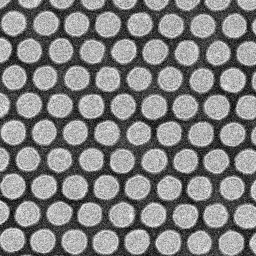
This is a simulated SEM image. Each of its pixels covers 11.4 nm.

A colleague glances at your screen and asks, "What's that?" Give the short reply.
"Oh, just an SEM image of a regular array of raised bodies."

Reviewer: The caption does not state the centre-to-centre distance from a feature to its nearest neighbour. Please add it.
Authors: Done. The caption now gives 30.8 px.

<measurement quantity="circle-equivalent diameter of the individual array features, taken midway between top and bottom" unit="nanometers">276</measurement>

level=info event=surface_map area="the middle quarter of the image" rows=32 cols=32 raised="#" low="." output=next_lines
................................
.####....####....####....###....
.#####..######..######..#####...
######..######..######..######..
######..######..######..#####...
.####...#####....####...#####...
..........##.............###....
................................
#....####....####....####...####
##..######..######..#####...####
##..######..######..######.#####
##..######..######..######.#####
#...#####....####...#####...####
..............##.....##......##.
..##......##......#.............
.#####..#####....####...#####...
######..######..######..#####...
######..######..######.######..#
#####...######..#####...#####..#
.####....####....###....####....
................................
.....###......#.......##......##
##..######..#####...#####...####
##..######..#####...######..####
##..######..#####...######..####
#....#####..#####...#####...####
......#.....####.....###....####
................................
.####....###.....###.....###....
#####...#####...#####...#####...
######..######.######..######..#
######..######.######..######..#